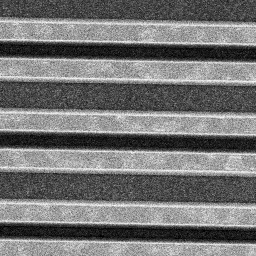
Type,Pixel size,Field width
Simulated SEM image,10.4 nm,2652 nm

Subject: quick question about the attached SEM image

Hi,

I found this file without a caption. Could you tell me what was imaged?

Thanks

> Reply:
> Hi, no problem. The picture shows parallel lines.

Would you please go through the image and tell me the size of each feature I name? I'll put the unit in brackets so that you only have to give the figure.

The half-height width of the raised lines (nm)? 233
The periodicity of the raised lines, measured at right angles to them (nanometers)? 470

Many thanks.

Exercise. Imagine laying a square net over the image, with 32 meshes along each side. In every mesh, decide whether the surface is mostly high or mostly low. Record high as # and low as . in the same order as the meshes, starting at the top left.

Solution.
................................
................................
###.............................
################################
################################
..............##################
................................
######################..........
################################
################################
................................
................................
................................
................................
################################
################################
################################
................................
###.............................
################################
################################
...................#############
................................
................................
................................
###################.............
################################
################################
..............................##
................................
################################
################################